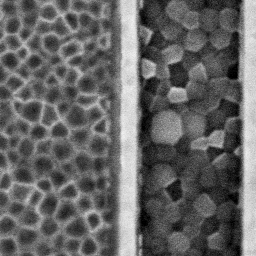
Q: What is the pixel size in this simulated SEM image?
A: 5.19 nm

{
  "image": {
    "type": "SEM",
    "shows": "one or a few lines or trenches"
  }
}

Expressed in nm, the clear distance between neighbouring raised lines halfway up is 637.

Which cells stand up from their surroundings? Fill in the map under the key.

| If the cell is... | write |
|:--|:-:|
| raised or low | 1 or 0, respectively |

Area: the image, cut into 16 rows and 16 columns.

1111111100000000
1111111100000000
1111111100000000
1111111100000000
1111111100000000
1111111100000000
1111111100000000
1111111100000000
1111111100000000
1111111100000000
1111111100000000
1111111100000000
1111111100000000
1111111100000000
1111111100000000
1111111100000000